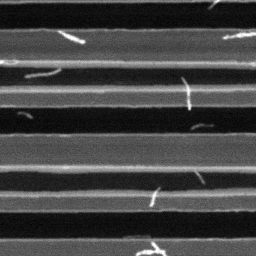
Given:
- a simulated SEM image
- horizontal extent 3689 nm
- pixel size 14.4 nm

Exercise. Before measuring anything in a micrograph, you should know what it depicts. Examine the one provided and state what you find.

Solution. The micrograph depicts lines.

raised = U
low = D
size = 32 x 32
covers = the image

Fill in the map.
DDDDDDDDDDDDDDDDDDDDDDDDDDDDDDDD
DDDDDDDDDDDDDDDDDDDDDDDDDDDDDDDD
DDDDDDDDDDDDDDDDDDDDDDDDDDDDDDDD
DDDDDDDDDDDDDDDDDDDDDDDDDDDDDDDD
UUUUUUUUUUUUUUUUUUUUUUUUUUUUUUUU
UUUUUUUUUUUUUUUUUUUUUUUUUUUUUUUU
UUUUUUUUUUUUUUUUUUUUUUUUUUUUUUUU
UUUUUUUUUUUUUUUUUUUUUUUUUUUUUUUU
DDDDDDDDDDDDDDDDDDDDDDDDDDDDDDDD
DDDDDDDDDDDDDDDDDDDDDDDDDDDDDDDD
DDDDDDDDDDDDDDDDDDDDDDDDDDDDDDDD
UUUUUUUUUUUUUUUUUUUUUUUUUUUUUUUU
UUUUUUUUUUUUUUUUUUUUUUUUUUUUUUUU
DDDDDDDDDDDDDDDDDDDDDDDDDDDDDDDD
DDDDDDDDDDDDDDDDDDDDDDDDDDDDDDDD
DDDDDDDDDDDDDDDDDDDDDDDDDDDDDDDD
DDDDDDDDDDDDDDDDDDDDDDDDDDDDDDDD
UUUUUUUUUUUUUUUUUUUUUUUUUUUUUUUU
UUUUUUUUUUUUUUUUUUUUUUUUUUUUUUUU
UUUUUUUUUUUUUUUUUUUUUUUUUUUUUUUU
UUUUUUUUUUUUUUUUUUUUUUUUUUUUUUUU
DDDDDDDDDDDDDDDDDDDDDDDDDDDDDDDD
DDDDDDDDDDDDDDDDDDDDDDDDDDDDDDDD
DDDDDDDDDDDDDDDDDDDDDDDDDDDDDDDD
UUUUUUUUUUUUUUUUUUUUUUUUUUUUUUUU
UUUUUUUUUUUUUUUUUUUUUUUUUUUUUUUU
DDDDDDDDDDDDDDDDDDDDDDDDDDDDDDDD
DDDDDDDDDDDDDDDDDDDDDDDDDDDDDDDD
DDDDDDDDDDDDDDDDDDDDDDDDDDDDDDDD
DDDDDDDDDDDDDDDDDDDDDDDDDDDDDDDD
UUUUUUUUUUUUUUUUUUUUUUUUUUUUUUUU
UUUUUUUUUUUUUUUUUUUUUUUUUUUUUUUU